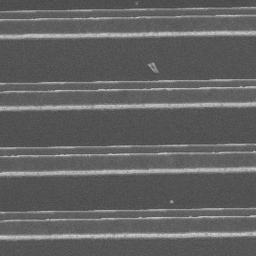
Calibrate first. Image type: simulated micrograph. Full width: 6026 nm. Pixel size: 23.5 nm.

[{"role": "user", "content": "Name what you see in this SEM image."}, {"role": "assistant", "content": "lines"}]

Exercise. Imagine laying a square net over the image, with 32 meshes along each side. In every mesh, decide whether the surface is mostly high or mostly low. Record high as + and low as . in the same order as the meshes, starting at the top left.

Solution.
................................
++++++++++++++++++++++++++++++++
++++++++++++++++++++++++++++++++
++++++++++++++++++++++++++++++++
................................
................................
................................
................................
................................
................................
++++++++++++++++++++++++++++++++
++++++++++++++++++++++++++++++++
++++++++++++++++++++++++++++++++
................................
................................
................................
................................
................................
.+++++++++++++++++++++++++++++++
++++++++++++++++++++++++++++++++
++++++++++++++++++++++++++++++++
++++++++++......................
................................
................................
................................
................................
......++++++++++++++++++++++++++
++++++++++++++++++++++++++++++++
++++++++++++++++++++++++++++++++
++++............................
................................
................................